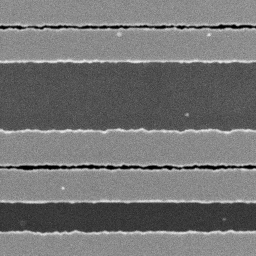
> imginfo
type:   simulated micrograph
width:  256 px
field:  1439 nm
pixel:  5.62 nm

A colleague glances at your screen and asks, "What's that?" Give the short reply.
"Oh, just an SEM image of lines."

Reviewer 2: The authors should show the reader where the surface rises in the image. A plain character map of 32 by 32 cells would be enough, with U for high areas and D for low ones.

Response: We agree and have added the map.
UUUUUUUUUUUUUUUUUUUUUUUUUUUUUUUU
UUUUUUUUUUUUUUUUUUUUUUUUUUUUUUUU
UUUUUUUUUUUUUUUUUUUUUUUUUUUUUUUU
UUUUUUUUUUUUUUUUUUUUUUUUUUUUUUUU
UUUUUUUUUUUUUUUUUUUUUUUUUUUUUUUU
UUUUUUUUUUUUUUUUUUUUUUUUUUUUUUUU
UUUUUUUUUUUUUUUUUUUUUUUUUUUUUUUU
UUUUUUUUUUUUUUUUUUUUUUUUUUUUUUUU
DDDDDDDDDDDDDDDDDDDDDDDDDDDDDDDD
DDDDDDDDDDDDDDDDDDDDDDDDDDDDDDDD
DDDDDDDDDDDDDDDDDDDDDDDDDDDDDDDD
DDDDDDDDDDDDDDDDDDDDDDDDDDDDDDDD
DDDDDDDDDDDDDDDDDDDDDDDDDDDDDDDD
DDDDDDDDDDDDDDDDDDDDDDDDDDDDDDDD
DDDDDDDDDDDDDDDDDDDDDDDDDDDDDDDD
DDDDDDDDDDDDDDDDDDDDDDDDDDDDDDDD
UUUUUUUUUUUUUUUUUUUUUUUUUUUUUUUU
UUUUUUUUUUUUUUUUUUUUUUUUUUUUUUUU
UUUUUUUUUUUUUUUUUUUUUUUUUUUUUUUU
UUUUUUUUUUUUUUUUUUUUUUUUUUUUUUUU
UUUUUUUUUUUUUUUUUUUUUUUUUUUUUUUU
UUUUUUUUUUUUUUUUUUUUUUUUUUUUUUUU
UUUUUUUUUUUUUUUUUUUUUUUUUUUUUUUU
UUUUUUUUUUUUUUUUUUUUUUUUUUUUUUUU
UUUUUUUUUUUUUUUUUUUUUUUUUUUUUUUU
DDDDDDDDDDDDDDDDDDDDDDDDDDDDDDDD
DDDDDDDDDDDDDDDDDDDDDDDDDDDDDDDD
DDDDDDDDDDDDDDDDDDDDDDDDDDDDDDDD
DDDDDDDDDDDDDDDDDDDDDDDDDDDDDDDD
UUUUUUUUUUUUUUUUUUUUUUUUUUUUUUUU
UUUUUUUUUUUUUUUUUUUUUUUUUUUUUUUU
UUUUUUUUUUUUUUUUUUUUUUUUUUUUUUUU